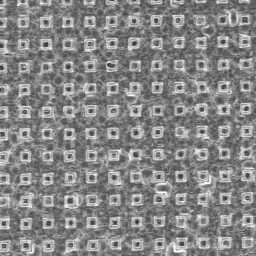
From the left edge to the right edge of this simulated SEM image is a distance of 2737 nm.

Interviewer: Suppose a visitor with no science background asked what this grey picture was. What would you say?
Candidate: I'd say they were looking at holes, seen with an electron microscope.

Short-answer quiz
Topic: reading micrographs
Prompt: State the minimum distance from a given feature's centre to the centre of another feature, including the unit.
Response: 144 nm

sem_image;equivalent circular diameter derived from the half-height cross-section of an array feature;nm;38.1